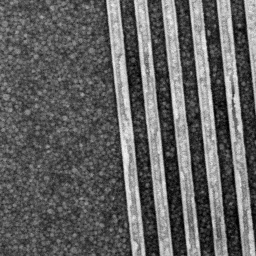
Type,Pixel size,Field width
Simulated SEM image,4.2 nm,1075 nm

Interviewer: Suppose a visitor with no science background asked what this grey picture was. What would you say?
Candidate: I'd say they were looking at parallel lines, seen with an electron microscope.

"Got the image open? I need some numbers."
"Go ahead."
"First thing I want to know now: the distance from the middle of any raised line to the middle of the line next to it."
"0.115 um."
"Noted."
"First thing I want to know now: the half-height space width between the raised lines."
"0.0658 microns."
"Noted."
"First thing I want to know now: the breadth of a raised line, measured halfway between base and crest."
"11.8 pixels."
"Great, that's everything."